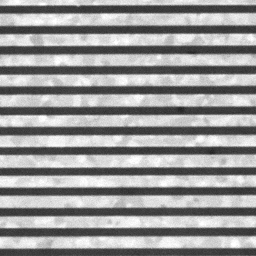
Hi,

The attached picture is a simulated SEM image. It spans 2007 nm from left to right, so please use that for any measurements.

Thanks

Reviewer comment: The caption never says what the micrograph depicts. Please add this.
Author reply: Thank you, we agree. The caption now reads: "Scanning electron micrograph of parallel lines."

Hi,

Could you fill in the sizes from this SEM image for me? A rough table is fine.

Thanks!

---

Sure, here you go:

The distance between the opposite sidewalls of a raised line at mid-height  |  84.2 nanometres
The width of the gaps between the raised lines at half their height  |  0.0774 microns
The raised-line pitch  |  159 nm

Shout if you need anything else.